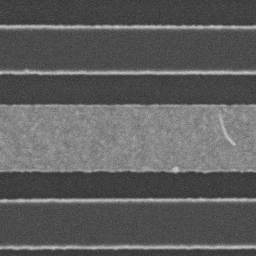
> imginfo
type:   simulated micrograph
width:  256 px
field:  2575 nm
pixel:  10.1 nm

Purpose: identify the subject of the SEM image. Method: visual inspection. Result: lines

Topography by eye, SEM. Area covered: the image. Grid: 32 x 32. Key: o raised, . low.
................................
................................
................................
oooooooooooooooooooooooooooooooo
oooooooooooooooooooooooooooooooo
oooooooooooooooooooooooooooooooo
oooooooooooooooooooooooooooooooo
oooooooooooooooooooooooooooooooo
oooooooooooooooooooooooooooooooo
................................
................................
................................
................................
oooooooooooooooooooooooooooooooo
oooooooooooooooooooooooooooooooo
oooooooooooooooooooooooooooooooo
oooooooooooooooooooooooooooooooo
oooooooooooooooooooooooooooooooo
oooooooooooooooooooooooooooooooo
oooooooooooooooooooooooooooooooo
oooooooooooooooooooooooooooooooo
.....................o...o......
................................
................................
................................
oooooooooooooooooooooooooooooooo
oooooooooooooooooooooooooooooooo
oooooooooooooooooooooooooooooooo
oooooooooooooooooooooooooooooooo
oooooooooooooooooooooooooooooooo
oooooooooooooooooooooooooooooooo
................................